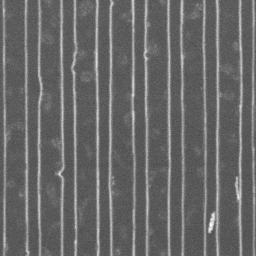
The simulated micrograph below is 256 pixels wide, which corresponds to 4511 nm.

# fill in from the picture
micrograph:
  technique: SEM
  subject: parallel lines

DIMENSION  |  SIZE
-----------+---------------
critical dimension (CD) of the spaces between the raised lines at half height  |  0.388 microns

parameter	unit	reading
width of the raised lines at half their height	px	13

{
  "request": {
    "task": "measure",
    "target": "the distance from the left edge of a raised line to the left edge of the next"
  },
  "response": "0.629 µm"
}